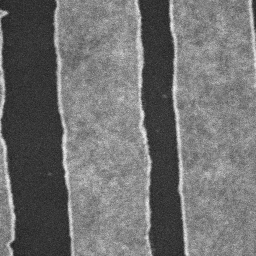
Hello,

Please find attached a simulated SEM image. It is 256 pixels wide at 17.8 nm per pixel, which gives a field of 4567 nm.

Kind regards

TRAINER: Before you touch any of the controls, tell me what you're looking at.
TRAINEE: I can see one or a few lines or trenches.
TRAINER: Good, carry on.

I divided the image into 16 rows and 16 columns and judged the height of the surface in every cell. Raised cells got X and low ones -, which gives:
----XXXXX--XXXXX
---XXXXXX--XXXXX
----XXXXX--XXXXX
----XXXXX--XXXXX
----XXXXX--XXXXX
----XXXXX--XXXXX
----XXXXX--XXXXX
----XXXXX--XXXXX
----XXXXX--XXXXX
----XXXXX--XXXXX
----XXXXX--XXXXX
X---XXXXX--XXXXX
X---XXXXX--XXXXX
X---XXXXX--XXXXX
X---XXXXX---XXXX
X----XXXX---XXXX